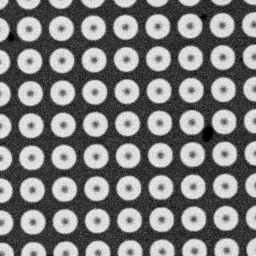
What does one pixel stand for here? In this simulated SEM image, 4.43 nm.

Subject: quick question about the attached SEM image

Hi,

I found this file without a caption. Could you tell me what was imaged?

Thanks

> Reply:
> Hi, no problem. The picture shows an array of small figures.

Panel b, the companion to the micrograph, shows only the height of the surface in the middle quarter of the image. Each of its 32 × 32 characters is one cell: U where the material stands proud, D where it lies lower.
UUDDDUUUUUDDDUUUUUDDDUUUUUDDDUUU
UDDDDDUUUDDDDDUUUDDDDDUUUDDDDDDU
DDDDDDDDDDDDDDDDDDDDDDDDDDDDDDDD
DDDDDDDDDDDDDDDDDDDDDDDDDDDDDDDD
UDDDDDUUUDDDDDUUUDDDDDUUUUDDDDUU
UUDDDUUUUUDDDUUUUUDDDUUUUUUDDUUU
UUUDDUUUUUUDDUUUUUUDDUUUUUUDDUUU
UUUDDUUUUUUDDUUUUUUDDUUUUUUDDUUU
UUDDDUUUUUDDDUUUUUDDDUUUUUDDDDUU
UUDDDDUUUDDDDDUUUDDDDDDUUDDDDDDU
DDDDDDDDDDDDDDDDDDDDDDDDDDDDDDDD
DDDDDDDDDDDDDDDDDDDDDDDDDDDDDDDD
UDDDDDUUUDDDDDUUUUDDDDUUUUDDDDUU
UUDDDUUUUUDDDUUUUUUDDUUUUUUDDUUU
UUUDDUUUUUUDDUUUUUUDDUUUUUUDDUUU
UUUDDUUUUUUDDUUUUUUDDUUUUUUDDUUU
UUDDDUUUUUUDDUUUUUUDDUUUUUDDDDUU
UUDDDDUUUUDDDDUUUUDDDDDUUDDDDDDD
DDDDDDDDDDDDDDDDDDDDDDDDDDDDDDDD
DDDDDDDDDDDDDDDDDDDDDDDDDDDDDDDD
UDDDDDUUUDDDDDUUUUDDDDUUUUDDDDUU
UUDDDUUUUUUDDUUUUUUDDUUUUUUDDUUU
UUUDDUUUUUUDDUUUUUUDDUUUUUUDDUUU
UUUDDUUUUUUDDUUUUUUDDUUUUUUDDUUU
UUUDDUUUUUUDDDUUUUUDDDUUUUUDDDUU
UUDDDDUUUUDDDDUUUUDDDDDUUDDDDDDU
DDDDDDDDDDDDDDDDDDDDDDDDDDDDDDDD
DDDDDDDDDDDDDDDDDDDDDDDDDDDDDDDD
UDDDDDDUUUDDDDDUUUDDDDUUUUDDDDUU
UUUDDDUUUUUDDDUUUUUDDDUUUUUDDDUU
UUUDDUUUUUUDDUUUUUUDDUUUUUUDDUUU
UUUDDUUUUUUDDUUUUUUDDUUUUUUDDUUU